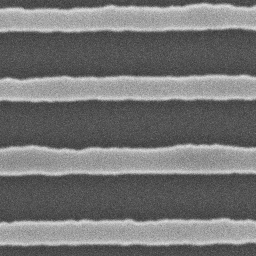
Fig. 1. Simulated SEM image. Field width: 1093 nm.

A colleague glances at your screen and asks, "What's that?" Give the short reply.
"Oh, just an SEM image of lines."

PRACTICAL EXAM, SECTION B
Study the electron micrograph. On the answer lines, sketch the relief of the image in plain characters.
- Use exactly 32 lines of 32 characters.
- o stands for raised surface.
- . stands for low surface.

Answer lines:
................................
oooooooooooooooooooooooooooooooo
oooooooooooooooooooooooooooooooo
oooooooooooooooooooooooooooo..oo
................................
................................
................................
................................
................................
.........................oooo.o.
oooooooooooooooooooooooooooooooo
oooooooooooooooooooooooooooooooo
.oooooooo.......................
................................
................................
................................
................................
................................
.ooooo...............ooooooooo..
oooooooooooooooooooooooooooooooo
oooooooooooooooooooooooooooooooo
ooooooooooooooooooooooooooooo..o
................................
................................
................................
................................
................................
...........................oo...
oooooooooooooooooooooooooooooooo
oooooooooooooooooooooooooooooooo
ooooo.ooo......o..ooo...o.......
................................